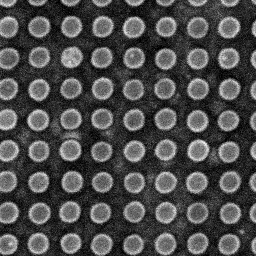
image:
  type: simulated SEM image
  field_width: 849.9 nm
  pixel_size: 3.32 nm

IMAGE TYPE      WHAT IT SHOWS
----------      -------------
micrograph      a regular array of raised bodies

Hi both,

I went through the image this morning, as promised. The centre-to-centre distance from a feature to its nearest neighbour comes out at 0.101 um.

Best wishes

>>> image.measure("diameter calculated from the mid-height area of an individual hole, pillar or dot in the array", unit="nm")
66.3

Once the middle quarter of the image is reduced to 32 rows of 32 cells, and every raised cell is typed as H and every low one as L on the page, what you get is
LHHLLLLLHHHLLLLLHHHLLLLHHHHLLLLL
LLLLLLLLLLLLLLLLLLLLLLLLLLLLLLLL
LLLLLLLLLLLLLLLLLLLLLLLLLLLLLLLL
LLLLLLLLLLLLLLLLLLLLLLLLLLLLLLLL
HHHHLLLLHHHHLLLLHHHLLLLHHHHLLLLL
HHHHLLLHHHHHLLLHHHHHLLLHHHHHLLLH
HHHHLLLHHHHHLLLHHHHHLLLHHHHHLLLH
HHHHLLLHHHHHLLLHHHHHLLLHHHHLLLLH
LHLLLLLLHHLLLLLLHHHLLLLLLHLLLLLL
LLLLLLLLLLLLLLLLLLLLLLLLLLLLLLLL
LLLLLLLLLLLLLLLLLLLLLLLLLLLLLLLL
LHHLLLLLLHHLLLLLLLLLLLLLHHHLLLLL
HHHHLLLHHHHHLLLLHHHHLLLHHHHHLLLL
HHHHLLLHHHHHLLLHHHHHLLLHHHHHLLLH
HHHHLLLHHHHHLLLHHHHHLLLHHHHHLLLH
HHHLLLLLHHHLLLLLHHHLLLLHHHHLLLLH
LLLLLLLLLLLLLLLLLHLLLLLLLLLLLLLL
HHHLLLLLLLLLLLLLLLLLLLLLLLLLLLLL
LLLLLLLLLLLLLLLLLLLLLLLLLLLLLLLL
LHHLLLLLLLLLLLLLLHLLLLLLHHHLLLLL
HHHHLLLHHHHHLLLLHHHHLLLHHHHHLLLL
HHHHLLLHHHHHLLLHHHHHLLLHHHHHLLLH
HHHHLLLHHHHHLLLHHHHHLLLHHHHHLLLH
HHHLLLLLHHHLLLLLHHHLLLLLHHHLLLLL
LLLLLLLLLLLLLLLLLLLLLLLLLLLLLLLL
LLLLLLLLLLLLLLLLLLLLLLLLLLLLLLLL
LLLLLLLLLLLLLLLLLLLLLLLLLLLLLLLL
HHHHLLLLLHHLLLLLHHHLLLLLHHHLLLLL
HHHHLLLLHHHHLLLLHHHHLLLHHHHHLLLH
HHHHLLLHHHHHLLLHHHHHLLLHHHHHLLLH
HHHHLLLHHHHHLLLHHHHHLLLHHHHHLLLH
HHHHLLLLHHHLLLLLHHHLLLLLHHHLLLLH